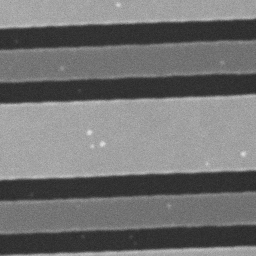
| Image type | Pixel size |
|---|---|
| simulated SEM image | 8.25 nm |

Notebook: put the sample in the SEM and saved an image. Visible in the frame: lines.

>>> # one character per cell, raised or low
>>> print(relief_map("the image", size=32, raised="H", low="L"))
HHHHHHHHHHHHHHHHHHHHHHHHHHHHHHHH
HHHHHHHHHHHHHHHHHHHHHHHHHHHHHHHH
HHHHHHHHHHHHHHHHHHHHHHHHHHHLLLLL
LLLLLLLLLLLLLLLLLLLLLLLLLLLLLLLL
LLLLLLLLLLLLLLLLLLLLLLLLLLLLLLLL
LLLLLLLLLLLLLLLLLLLLHHHHHHHHHHHH
HHHHHHHHHHHHHHHHHHHHHHHHHHHHHHHH
HHHHHHHHHHHHHHHHHHHHHHHHHHHHHHHH
HHHHHHHHHHHHHHHHHHHHHHHHHHHHHHHH
HHHHHHHHHHHHHHHHHHHHLLLLLLLLLLLL
LLLLLLLLLLLLLLLLLLLLLLLLLLLLLLLL
LLLLLLLLLLLLLLLLLLLLLLLLLLLLLLLL
LLLLLLLLLLLLLLLLLHHHHHHHHHHHHHHH
HHHHHHHHHHHHHHHHHHHHHHHHHHHHHHHH
HHHHHHHHHHHHHHHHHHHHHHHHHHHHHHHH
HHHHHHHHHHHHHHHHHHHHHHHHHHHHHHHH
HHHHHHHHHHHHHHHHHHHHHHHHHHHHHHHH
HHHHHHHHHHHHHHHHHHHHHHHHHHHHHHHH
HHHHHHHHHHHHHHHHHHHHHHHHHHHHHHHH
HHHHHHHHHHHHHHHHHHHHHHHHHHHHHHHH
HHHHHHHHHHHHHHHHHHHHHHHHHHHHHHHH
HHHHHHHHHHHHHHHHHHHHHHHHHLLLLLLL
LLLLLLLLLLLLLLLLLLLLLLLLLLLLLLLL
LLLLLLLLLLLLLLLLLLLLLLLLLLLLLLLL
LLLLLLLLLLLLLLLLLLLHHHHHHHHHHHHH
HHHHHHHHHHHHHHHHHHHHHHHHHHHHHHHH
HHHHHHHHHHHHHHHHHHHHHHHHHHHHHHHH
HHHHHHHHHHHHHHHHHHHHHHHHHHHHHHHH
HHHHHHHHHHHHHHHHHHLLLLLLLLLLLLLL
LLLLLLLLLLLLLLLLLLLLLLLLLLLLLLLL
LLLLLLLLLLLLLLLLLLLLLLLLLLLLLLLL
LLLLLLLLLLLLLLLHHHHHHHHHHHHHHHHH